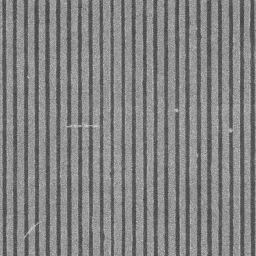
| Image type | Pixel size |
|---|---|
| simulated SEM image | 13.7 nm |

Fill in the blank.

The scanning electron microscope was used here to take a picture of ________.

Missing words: parallel lines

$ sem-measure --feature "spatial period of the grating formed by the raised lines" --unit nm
147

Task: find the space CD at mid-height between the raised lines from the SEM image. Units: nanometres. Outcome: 59.8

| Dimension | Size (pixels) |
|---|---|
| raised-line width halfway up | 6.25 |